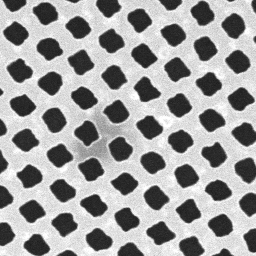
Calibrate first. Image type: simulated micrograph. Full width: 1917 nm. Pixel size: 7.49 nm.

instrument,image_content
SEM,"a regular array of holes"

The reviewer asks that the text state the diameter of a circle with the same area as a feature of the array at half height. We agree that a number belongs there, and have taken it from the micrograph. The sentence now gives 170 nanometers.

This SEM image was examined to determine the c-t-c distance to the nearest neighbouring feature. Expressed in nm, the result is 261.